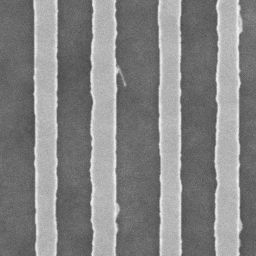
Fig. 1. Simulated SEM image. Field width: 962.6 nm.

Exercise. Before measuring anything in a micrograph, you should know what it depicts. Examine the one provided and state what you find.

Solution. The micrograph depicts lines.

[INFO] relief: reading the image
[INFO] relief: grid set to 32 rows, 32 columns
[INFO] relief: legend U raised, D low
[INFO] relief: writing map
DDDDUUUDDDDDUUDDDDDDUUUDDDDUUUDD
DDDDUUUDDDDDUUDDDDDDUUUDDDDUUUDD
DDDDUUUDDDDDUUDDDDDDUUDDDDDUUUDD
DDDDUUUDDDDDUUUDDDDDUUDDDDDUUUDD
DDDDUUUDDDDDUUUDDDDDUUUDDDDUUUDD
DDDDUUUDDDDUUUDDDDDDUUUDDDDUUUDD
DDDDUUUDDDDUUUDDDDDDUUUDDDDUUUDD
DDDDUUUDDDDUUUDDDDDDUUUDDDDUUUDD
DDDDUUUDDDDUUUDDDDDDUUDDDDDUUUDD
DDDDUUUDDDDUUUDDDDDDUUUDDDDUUUDD
DDDDUUUDDDDUUUUDDDDDUUDDDDDUUUDD
DDDDUUUDDDDUUUUDDDDDUUUDDDDUUUDD
DDDDUUUDDDDDUUDDDDDDUUDDDDDUUUDD
DDDDUUUDDDDDUUDDDDDDUUUDDDDUUUDD
DDDDUUUDDDDUUUDDDDDDUUUDDDDUUUDD
DDDDUUUDDDDUUUDDDDDDUUUDDDDUUUDD
DDDDUUUDDDDUUUDDDDDDUUUDDDDUUUDD
DDDDUUUDDDDUUUDDDDDDUUUDDDDUUUDD
DDDDUUUDDDDUUUDDDDDDUUUDDDDUUUDD
DDDDUUUDDDDUUUDDDDDDUUUDDDDUUUDD
DDDDUUUDDDDUUUDDDDDDUUUDDDDUUUDD
DDDDUUUDDDDUUUDDDDDDUUUDDDDUUUDD
DDDDUUUDDDDUUUDDDDDDUUUDDDDUUUDD
DDDDUUUDDDDDUUDDDDDDUUUDDDDUUUDD
DDDDUUUDDDDUUUDDDDDDUUUDDDDUUUDD
DDDDUUUDDDDUUUDDDDDDUUUDDDDUUUDD
DDDDUUUDDDDUUUDDDDDDUUUDDDDUUUDD
DDDDUUUDDDDUUUDDDDDDUUUDDDDUUUDD
DDDDDUUDDDDDUUUDDDDDUUUDDDDUUUDD
DDDDDUUDDDDDUUDDDDDDUUUDDDDUUUDD
DDDDUUUDDDDDUUDDDDDDUUUDDDDUUUDD
DDDDUUUDDDDUUUDDDDDDUUUDDDDUUUDD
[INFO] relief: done